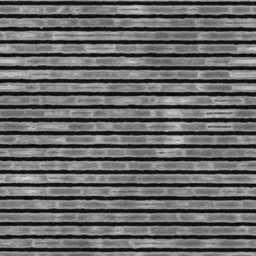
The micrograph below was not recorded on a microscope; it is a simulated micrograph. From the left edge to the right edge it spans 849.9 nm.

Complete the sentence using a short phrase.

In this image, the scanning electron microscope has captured parallel lines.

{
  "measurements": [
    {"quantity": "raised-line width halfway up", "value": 27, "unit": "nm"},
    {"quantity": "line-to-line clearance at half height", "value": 0.015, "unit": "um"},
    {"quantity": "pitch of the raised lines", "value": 0.0432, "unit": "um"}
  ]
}